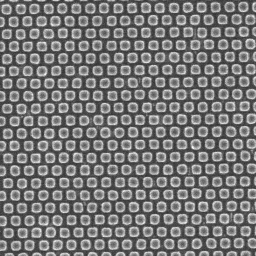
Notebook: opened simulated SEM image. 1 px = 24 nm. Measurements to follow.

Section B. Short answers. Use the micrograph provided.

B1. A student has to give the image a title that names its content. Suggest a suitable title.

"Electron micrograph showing a regular array of raised bodies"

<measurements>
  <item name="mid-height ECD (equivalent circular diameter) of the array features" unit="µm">0.235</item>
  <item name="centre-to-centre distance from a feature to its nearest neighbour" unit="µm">0.326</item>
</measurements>